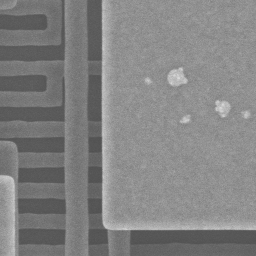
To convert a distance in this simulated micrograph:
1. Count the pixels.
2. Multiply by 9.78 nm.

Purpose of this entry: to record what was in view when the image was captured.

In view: wiring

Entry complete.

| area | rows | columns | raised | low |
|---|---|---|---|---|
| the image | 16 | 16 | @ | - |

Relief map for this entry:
------@@@@@@@@@@
------@@@@@@@@@@
------@@@@@@@@@@
------@@@@@@@@@@
------@@@@@@@@@@
------@@@@@@@@@@
------@@@@@@@@@@
------@@@@@@@@@@
------@@@@@@@@@@
------@@@@@@@@@@
------@@@@@@@@@@
@-----@@@@@@@@@@
@-----@@@@@@@@@@
@-----@@@@@@@@@@
@---------------
@---------------